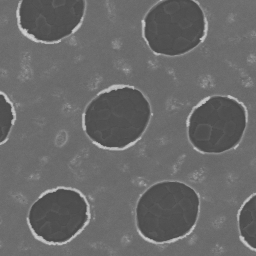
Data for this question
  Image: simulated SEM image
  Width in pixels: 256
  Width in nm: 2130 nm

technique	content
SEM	holes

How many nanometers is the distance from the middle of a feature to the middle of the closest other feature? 830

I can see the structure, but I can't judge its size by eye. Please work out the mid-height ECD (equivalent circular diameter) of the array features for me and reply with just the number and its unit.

0.486 micrometres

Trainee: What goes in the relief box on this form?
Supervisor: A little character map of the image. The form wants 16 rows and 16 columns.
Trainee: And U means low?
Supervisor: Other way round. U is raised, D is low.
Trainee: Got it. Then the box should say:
UDDDDUUUUUDDUUUU
UDDDDUUUUDDDDUUU
UUUUUUUUUDDDDUUU
UUUUUUUUUUUUUUUU
UUUUUUUUUUUUUUUU
UUUUUUUUUUUUUUUU
DUUUUUDDDUUUUDDU
DUUUUDDDDUUUDDDU
UUUUUUDDDUUUDDDU
UUUUUUUUUUUUUUUU
UUUUUUUUUUUUUUUU
UUUUUUUUUUDUUUUU
UUDDDUUUUDDDUUUU
UUDDDUUUUDDDUUUD
UUDDDUUUUDDDUUUD
UUUUUUUUUUUUUUUU